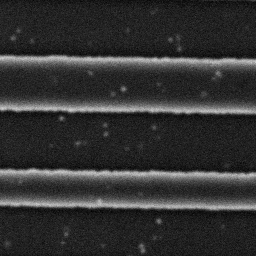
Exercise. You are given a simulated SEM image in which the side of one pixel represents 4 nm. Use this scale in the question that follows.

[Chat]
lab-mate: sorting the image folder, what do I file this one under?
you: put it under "lines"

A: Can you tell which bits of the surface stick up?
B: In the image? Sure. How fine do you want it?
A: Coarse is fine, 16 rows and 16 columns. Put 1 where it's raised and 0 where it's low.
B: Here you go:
0000000000000000
0000000000000000
0000000000000000
0000000000000000
1111111111111111
1111111111111111
1111111111111111
0000000000000000
0000000000000000
0000000000000000
0000000000000000
1111111111111111
1111111111111111
0000000000000000
0000000000000000
0000000000000000